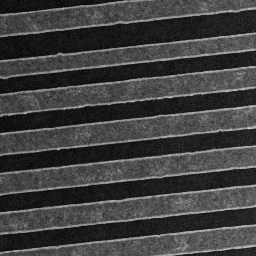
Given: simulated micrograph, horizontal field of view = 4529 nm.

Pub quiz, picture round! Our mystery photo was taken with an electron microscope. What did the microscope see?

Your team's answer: parallel lines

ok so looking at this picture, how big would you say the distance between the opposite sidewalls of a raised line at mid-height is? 358 nanometres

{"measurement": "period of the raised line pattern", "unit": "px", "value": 38.9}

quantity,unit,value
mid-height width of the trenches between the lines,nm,325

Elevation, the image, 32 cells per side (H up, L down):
LLLLLLLLLLLLLHHHHHHHHHHHHHHHHHHH
LLLLHHHHHHHHHHHHHHHHHHHHHHHHLLLL
HHHHHHHHHHHHHHHHHHHLLLLLLLLLLLLL
HHHHHHHHHHLLLLLLLLLLLLLLLLLLLLLL
HLLLLLLLLLLLLLLLLLLLLLLLLLLLLHHH
LLLLLLLLLLLLLLLLLLLLHHHHHHHHHHHH
LLLLLLLLLLLHHHHHHHHHHHHHHHHHHHLL
LLHHHHHHHHHHHHHHHHHHLLLLLLLLLLLL
HHHHHHHHHHLLLLLLLLLLLLLLLLLLLLHH
HHLLLLLLLLLLLLLLLLLLLLHHHHHHHHHH
LLLLLLLLLLLLHHHHHHHHHHHHHHHHHHHH
LLLHHHHHHHHHHHHHHHHHHHHHHHHLLLLL
HHHHHHHHHHHHHHHHHHLLLLLLLLLLLLLL
HHHHHHHHLLLLLLLLLLLLLLLLLLLLLLHH
LLLLLLLLLLLLLLLLLLLLHHHHHHHHHHHH
LLLLLLLLLLLHHHHHHHHHHHHHHHHHHHHH
LLLHHHHHHHHHHHHHHHHHHHHHHHLLLLLL
HHHHHHHHHHHHHHHHHLLLLLLLLLLLLLLL
HHHHHHHHLLLLLLLLLLLLLLLLLLLLLLHH
LLLLLLLLLLLLLLLLLLLLLHHHHHHHHHHH
LLLLLLLLLLLLHHHHHHHHHHHHHHHHHHHH
LLLHHHHHHHHHHHHHHHHHHHHHHHLLLLLL
HHHHHHHHHHHHHHHHLLLLLLLLLLLLLLLL
HHHHHHHLLLLLLLLLLLLLLLLLLLLLLHHH
LLLLLLLLLLLLLLLLLLLLHHHHHHHHHHHH
LLLLLLLLLLLHHHHHHHHHHHHHHHHHHHHH
LLHHHHHHHHHHHHHHHHHHHHHHHLLLLLLL
HHHHHHHHHHHHHHHHLLLLLLLLLLLLLLLL
HHHHHHHLLLLLLLLLLLLLLLLLLLLLHHHH
LLLLLLLLLLLLLLLLLLLHHHHHHHHHHHHH
LLLLLLLLLLHHHHHHHHHHHHHHHHHHHHHH
LHHHHHHHHHHHHHHHHHHHHHHHHLLLLLLL